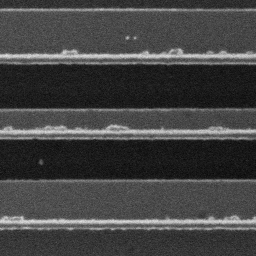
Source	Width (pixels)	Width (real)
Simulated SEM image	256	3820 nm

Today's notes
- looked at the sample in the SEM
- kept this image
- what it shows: lines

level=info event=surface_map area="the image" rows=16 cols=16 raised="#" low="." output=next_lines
................
################
################
################
................
................
................
################
################
................
................
################
################
################
................
................